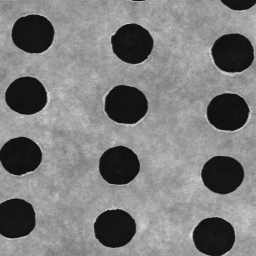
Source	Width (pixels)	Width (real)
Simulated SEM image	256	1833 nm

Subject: a regular array of holes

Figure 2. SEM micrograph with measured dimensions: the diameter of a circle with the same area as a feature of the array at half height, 0.288 um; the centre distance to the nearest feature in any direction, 0.44 µm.